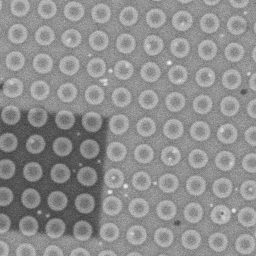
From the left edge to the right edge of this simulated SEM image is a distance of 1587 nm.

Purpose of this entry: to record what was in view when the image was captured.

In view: an array of small figures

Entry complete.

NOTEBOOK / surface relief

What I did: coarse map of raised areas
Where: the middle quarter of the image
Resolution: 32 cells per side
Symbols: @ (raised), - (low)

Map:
@@@@--@@@@---@@@@---@@@-----@---
@@@---@@@@---@@@@--@@@@@---@@@--
@@----@@@@---@@@@--@@@@@--@@@@@-
--------------@@----@@@@--@@@@@-
---------------------------@@@--
@@-----@------------------------
@@@---@@@----@@@----------------
@@@--@@@@@--@@@@---@@@@---@@@---
@@@--@@@@@--@@@@@--@@@@---@@@@--
------@@@---@@@@---@@@@---@@@@--
-------------@@----@@@@---@@@@--
---------------------------@@---
@@----@@------------------------
@@@--@@@@---@@@@----@-----------
@@@--@@@@--@@@@@---@@@----@@@---
@@---@@@@--@@@@@--@@@@@--@@@@@--
------@@----@@@@--@@@@@--@@@@@--
-------------------@@@---@@@@---
--------------------------@@----
@@---@@@------------------------
@@--@@@@@--@@@@----@@-----------
@@--@@@@@--@@@@---@@@@---@@@@---
@----@@@---@@@@---@@@@--@@@@@--@
-----------@@@@---@@@@--@@@@@--@
-------------------@@----@@@---@
--------------------------------
@---@@@-----@@------------------
@--@@@@@--@@@@@---@@@-----------
@--@@@@@--@@@@@--@@@@---@@@@---@
----@@@@--@@@@@--@@@@@--@@@@---@
-----------@@@---@@@@---@@@@---@
-------------------------@@@---@